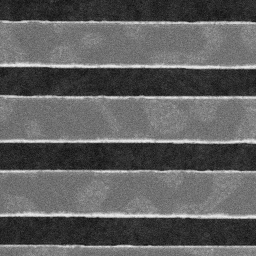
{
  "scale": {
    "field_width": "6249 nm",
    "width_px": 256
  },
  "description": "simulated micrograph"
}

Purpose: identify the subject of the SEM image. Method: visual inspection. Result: lines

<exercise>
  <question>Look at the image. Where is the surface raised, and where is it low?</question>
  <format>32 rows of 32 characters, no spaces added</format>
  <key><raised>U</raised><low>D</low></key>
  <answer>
DDDDDDDDDDDDDDDDDDDDDDDDDDDDDDDD
DDDDDDDDDDDDDDDDDDDDDDDDDDDDDDDD
DDDDDDDDDDDDDDDDDDDDDDDDDDDDDDDD
UUUUUUUUUUUUUUUUUUUUUUUUUUUUUUUU
UUUUUUUUUUUUUUUUUUUUUUUUUUUUUUUU
UUUUUUUUUUUUUUUUUUUUUUUUUUUUUUUU
UUUUUUUUUUUUUUUUUUUUUUUUUUUUUUUU
UUUUUUUUUUUUUUUUUUUUUUUUUUUUUUUU
DDDDDDDDDDDDDDDDDDDDDDDUUUDDUUUU
DDDDDDDDDDDDDDDDDDDDDDDDDDDDDDDD
DDDDDDDDDDDDDDDDDDDDDDDDDDDDDDDD
DDDDDDDDDDDDDDDDDDDDDDDDDDDDDDDD
UUUUUUUUUUUUUUUUUUUUUUUUUUUUUUUU
UUUUUUUUUUUUUUUUUUUUUUUUUUUUUUUU
UUUUUUUUUUUUUUUUUUUUUUUUUUUUUUUU
UUUUUUUUUUUUUUUUUUUUUUUUUUUUUUUU
UUUUUUUUUUUUUUUUUUUUUUUUUUUUUUUU
UUUUUUUUUUUUUUUUUUUUUUUUUUUUUUUU
DDDDDDDDDDDDDDDDDDDDDDDDDDDDDDDD
DDDDDDDDDDDDDDDDDDDDDDDDDDDDDDDD
DDDDDDDDDDDDDDDDDDDDDDDDDDDDDDDD
UUUUUUUUUUUUUUUUUUUUUUUUUUUUUUUU
UUUUUUUUUUUUUUUUUUUUUUUUUUUUUUUU
UUUUUUUUUUUUUUUUUUUUUUUUUUUUUUUU
UUUUUUUUUUUUUUUUUUUUUUUUUUUUUUUU
UUUUUUUUUUUUUUUUUUUUUUUUUUUUUUUU
UUUUUUUUUUUUUUUUUUUUUUUUUUUUUUUU
DDDDDDDDDDDDDDDDDDDDDDDDDDDDDDDD
DDDDDDDDDDDDDDDDDDDDDDDDDDDDDDDD
DDDDDDDDDDDDDDDDDDDDDDDDDDDDDDDD
DDDDDDDDDDDDDDDDDDDDDDDDDDDDDDDD
UUUUUUUUUUUUUUUUUUUUUUUUUUUUUUUU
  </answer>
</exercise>